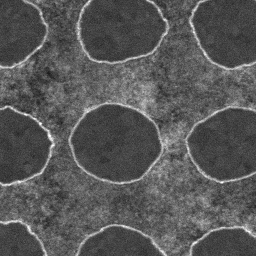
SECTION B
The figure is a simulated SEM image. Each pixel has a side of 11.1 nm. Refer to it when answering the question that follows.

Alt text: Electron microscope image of raised bodies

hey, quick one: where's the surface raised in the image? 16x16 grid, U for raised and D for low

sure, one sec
UUDDDUUUUUDDUUUU
UUUDDUUUUUDDUUUU
UUUDDUUUUUDDUUUU
UUDDDDUUUDDDDUUU
DDDDDDDDDDDDDDDD
DDDDDDDDDDDDDDDD
DDDDDDDDDDDDDDDD
UUDDDUUUUDDDDUUU
UUUDUUUUUUDDUUUU
UUUDDUUUUUDDUUUU
UUUDDUUUUDDDUUUU
UDDDDDDDDDDDDDDD
DDDDDDDDDDDDDDDD
DDDDDDDDDDDDDDDD
UUDDDDUUUDDDDUUU
UUUDDUUUUUDDUUUU